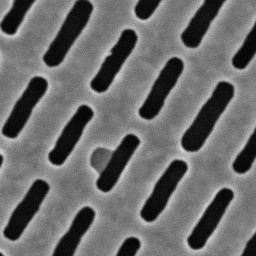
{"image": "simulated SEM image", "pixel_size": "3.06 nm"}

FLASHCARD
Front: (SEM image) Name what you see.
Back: a regular array of holes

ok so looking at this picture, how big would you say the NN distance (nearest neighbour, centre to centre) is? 0.166 microns